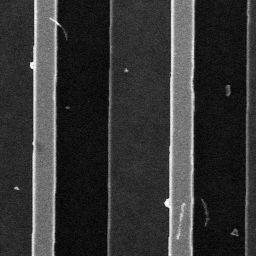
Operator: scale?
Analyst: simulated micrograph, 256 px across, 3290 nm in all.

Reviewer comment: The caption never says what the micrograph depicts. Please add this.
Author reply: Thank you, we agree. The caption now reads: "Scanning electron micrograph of lines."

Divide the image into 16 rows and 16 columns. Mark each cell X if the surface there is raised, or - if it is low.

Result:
XXX----XXXXX----
XXXX---XXXXX----
XXXX---XXXXX----
XXX----XXXXX----
XXX----XXXXX----
XXX----XXXXX----
XXX----XXXXX---X
XXX----XXXXX---X
XXX----XXXXX---X
XXX----XXXXX---X
XXX----XXXXX---X
XXX----XXXXX---X
XXX----XXXXX---X
XXX----XXXXX---X
XXX----XXXXX---X
XXX----XXXXX---X